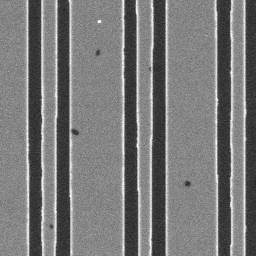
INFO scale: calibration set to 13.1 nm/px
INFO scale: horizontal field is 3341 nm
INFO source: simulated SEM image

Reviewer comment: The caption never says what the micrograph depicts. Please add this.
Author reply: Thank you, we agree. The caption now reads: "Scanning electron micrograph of lines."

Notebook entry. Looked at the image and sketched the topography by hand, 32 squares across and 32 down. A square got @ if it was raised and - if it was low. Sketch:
@@@--@@--@@@@@@--@@--@@@@@@--@@-
@@@--@@--@@@@@@--@@--@@@@@@--@@-
@@@--@@--@@@@@@--@@--@@@@@@--@@-
@@@--@@--@@@@@@--@@--@@@@@@--@@-
@@@--@@--@@@@@@--@@--@@@@@@--@@-
@@@--@@--@@@@@@--@@--@@@@@@--@@-
@@@--@@--@@@@@@--@@--@@@@@@--@@-
@@@--@@--@@@@@@--@@--@@@@@@--@@-
@@@--@@--@@@@@@--@@--@@@@@@--@@-
@@@--@@--@@@@@@--@@--@@@@@@--@@-
@@@--@@--@@@@@@--@@--@@@@@@--@@-
@@@--@@--@@@@@@--@@--@@@@@@--@@-
@@@--@@--@@@@@@--@@--@@@@@@--@@-
@@@--@@--@@@@@@--@@--@@@@@@--@@-
@@@--@@--@@@@@@--@@--@@@@@@--@@-
@@@--@@--@@@@@@--@@--@@@@@@--@@-
@@@--@@--@@@@@@--@@--@@@@@@--@@-
@@@--@@--@@@@@@--@@--@@@@@@--@@-
@@@--@@--@@@@@@--@@--@@@@@@--@@-
@@@--@@--@@@@@@--@@--@@@@@@--@@-
@@@--@@--@@@@@@--@@--@@@@@@--@@-
@@@--@@--@@@@@@--@@--@@@@@@--@@-
@@@--@@--@@@@@@--@@--@@@@@@--@@-
@@@@-@@--@@@@@@--@@--@@@@@@--@@-
@@@@-@@--@@@@@@--@@--@@@@@@--@@-
@@@@-@@--@@@@@@--@@--@@@@@@--@@-
@@@@-@@--@@@@@@--@@--@@@@@@--@@-
@@@@-@@--@@@@@@--@@--@@@@@@--@@-
@@@@-@@--@@@@@@--@@--@@@@@@--@@-
@@@--@@--@@@@@@--@@--@@@@@@--@@-
@@@@-@@--@@@@@@--@@--@@@@@@--@@-
@@@@-@@--@@@@@@--@@--@@@@@@--@@-